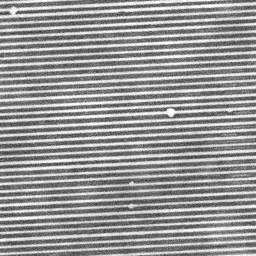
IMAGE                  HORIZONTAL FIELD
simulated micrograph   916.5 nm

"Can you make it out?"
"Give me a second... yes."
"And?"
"parallel lines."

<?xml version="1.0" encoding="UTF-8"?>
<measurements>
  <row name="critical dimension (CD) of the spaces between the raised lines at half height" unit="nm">17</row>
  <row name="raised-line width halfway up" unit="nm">6.7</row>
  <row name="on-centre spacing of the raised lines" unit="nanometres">24.9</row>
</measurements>